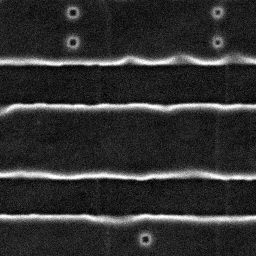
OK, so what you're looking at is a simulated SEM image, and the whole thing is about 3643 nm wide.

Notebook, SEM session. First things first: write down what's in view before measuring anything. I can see wiring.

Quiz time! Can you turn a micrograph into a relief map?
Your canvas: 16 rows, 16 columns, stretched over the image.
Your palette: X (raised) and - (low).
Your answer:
XXXXXXXXXXXXXXXX
XXXXXXXXXXXXXXXX
XXXXXXXXXXXXXXXX
XXXXXXXXXXXXXXXX
----------------
----------------
----------------
XXXXXXXXXXXXXXXX
XXXXXXXXXXXXXXXX
XXXXXXXXXXXXXXXX
XXXXXXXXXXXXXXXX
----------------
----------------
XXXXXX---X------
XXXXXXXXXXXXXXXX
XXXXXXXXXXXXXXXX